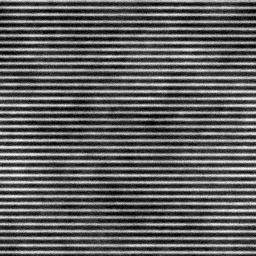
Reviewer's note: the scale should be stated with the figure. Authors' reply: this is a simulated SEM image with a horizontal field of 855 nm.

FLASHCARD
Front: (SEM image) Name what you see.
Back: parallel lines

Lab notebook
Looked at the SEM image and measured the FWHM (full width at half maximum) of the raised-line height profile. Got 5.8 nm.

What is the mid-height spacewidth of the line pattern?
0.0175 micrometres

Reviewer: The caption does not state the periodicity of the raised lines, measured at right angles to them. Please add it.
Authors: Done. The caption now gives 6.98 px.